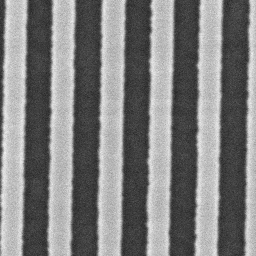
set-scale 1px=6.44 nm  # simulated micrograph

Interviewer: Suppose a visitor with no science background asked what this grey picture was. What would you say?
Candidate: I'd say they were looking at lines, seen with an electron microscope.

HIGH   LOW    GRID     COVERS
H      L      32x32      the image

LHHLLLLHHLLLLHHHLLLHHHLLLHHHLLLH
LHHLLLLHHLLLLHHHLLLHHHLLLHHHLLLH
LHHLLLLHHLLLLHHHLLLHHHLLLHHHLLLH
LHHLLLLHHLLLLHHLLLLHHHLLLHHHLLLH
LHHLLLLHHLLLLHHLLLLHHHLLLHHHLLLH
LHHLLLLHHLLLLHHLLLLHHHLLLHHHLLLH
LHHLLLHHHLLLLHHLLLLHHHLLLHHHLLLH
LHHLLLLHHLLLLHHLLLLHHHLLLHHHLLLH
HHHLLLHHHLLLLHHLLLLHHHLLLHHHLLLH
HHHLLLHHHLLLLHHLLLLHHHLLLHHHLLLH
HHHLLLHHHLLLLHHLLLLHHHLLLHHHLLLH
HHHLLLHHHLLLLHHLLLLHHHLLLHHHLLLH
HHHLLLHHHLLLLHHLLLLHHLLLLHHHLLLH
HHHLLLHHHLLLLHHLLLLHHLLLLHHHLLLH
HHHLLLHHHLLLHHHLLLLHHLLLLHHLLLLH
HHHLLLHHHLLLLHHLLLLHHLLLLHHLLLLH
HHHLLLHHHLLLLHHLLLLHHLLLLHHLLLLH
HHHLLLHHHLLLHHHLLLLHHLLLLHHLLLLH
HHHLLLHHHLLLHHHLLLLHHLLLLHHLLLLH
HHHLLLHHHLLLHHHLLLLHHLLLLHHLLLLH
HHHLLLHHHLLLHHHLLLLHHLLLLHHLLLLH
HHHLLLHHHLLLHHHLLLLHHLLLLHHLLLLH
HHHLLLHHHLLLHHHLLLLHHLLLLHHLLLLH
HHHLLLHHHLLLHHHLLLLHHLLLLHHLLLLH
HHHLLLHHHLLLHHHLLLLHHLLLLHHLLLLH
HHHLLLHHHLLLHHHLLLHHHLLLLHHLLLLH
HHHLLLHHHLLLHHHLLLHHHLLLLHHLLLLH
HHHLLLHHHLLLHHHLLLLHHLLLLHHLLLLH
HHHLLLHHHLLLHHHLLLLHHLLLLHHLLLLH
HHHLLLHHHLLLHHHLLLLHHLLLLHHLLLLH
HHHLLLHHHLLLHHHLLLLHHLLLHHHLLLLH
HHHLLLHHHLLLHHHLLLHHHLLLHHHLLLLH